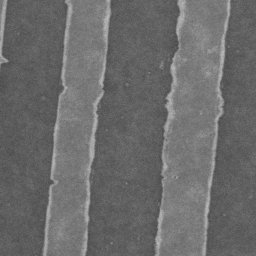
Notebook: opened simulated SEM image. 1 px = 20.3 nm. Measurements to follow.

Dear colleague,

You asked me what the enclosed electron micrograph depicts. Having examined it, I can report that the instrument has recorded one or a few lines or trenches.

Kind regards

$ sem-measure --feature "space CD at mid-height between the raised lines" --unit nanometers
1450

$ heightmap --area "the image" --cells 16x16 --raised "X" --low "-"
----XXX----XXX--
----XXX----XXX--
----XXX----XXX--
----XXX----XXX--
----XX-----XXX--
----XX-----XXX--
----XX-----XXX--
----XX-----XXX--
---XXX----XXXX--
---XXX----XXX---
---XXX----XXX---
---XXX----XXX---
---XXX----XXX---
---XX-----XXX---
---XX-----XXX---
---XX-----XXX---